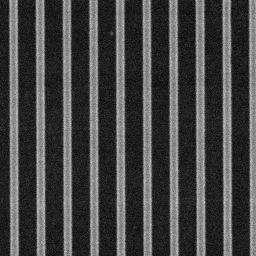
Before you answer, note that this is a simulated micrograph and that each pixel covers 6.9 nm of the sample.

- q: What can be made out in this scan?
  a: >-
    parallel lines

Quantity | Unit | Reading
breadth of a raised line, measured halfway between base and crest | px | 7.62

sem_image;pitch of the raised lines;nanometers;184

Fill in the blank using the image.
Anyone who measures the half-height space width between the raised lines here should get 131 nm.